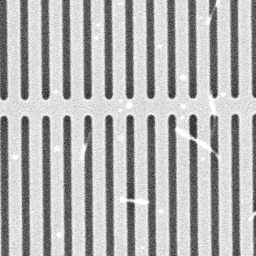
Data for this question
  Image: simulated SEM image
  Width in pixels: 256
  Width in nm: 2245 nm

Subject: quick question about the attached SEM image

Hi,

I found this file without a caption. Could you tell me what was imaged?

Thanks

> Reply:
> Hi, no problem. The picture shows groups of lines, slits or small figures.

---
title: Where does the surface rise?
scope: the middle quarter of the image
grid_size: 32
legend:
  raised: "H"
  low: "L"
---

LLHHHLLHHHLLHHHLLLHHLLLHHHLLHHHL
LLHHHLLHHHLLHHHLLLHHLLLHHHLLHHHL
LLHHHLLHHHLLHHHLLLHHLLLHHHLLHHHL
LLHHHLLHHHLLHHHLLLHHLLLHHHLLHHHL
LLHHHLLHHHLLHHHLLLHHLLLHHHLLHHHL
LLHHHLLHHHLLHHHLLLHHLLLHHHLLHHHL
LLHHHLLHHHLLHHHLLLHHLLLHHHLLHHHL
LLHHHLLHHHLLHHHLLLHHHLLHHHLLHHHL
LLHHHLLHHHLLHHHHLHHHHLHHHHLLHHHL
HHHHHHHHHHHHHHHHHHHHHHHHHHHHHHHH
HHHHHHHHHHHHHHHHHHHHHHHHHHHHHHHH
HHHHHHHHHHHHHHHHHHHHHHHHHHHHHHHH
HHHHHHHHHHHHHHHHLHHHHHHHHHHHHHHH
LLHHHLLHHHLLHHHLLLHHHLLHHHLLHHHL
LLHHHLLHHHLLHHHLLLHHHLLHHHLLHHHL
LLHHHLLHHHLLHHHLLLHHHLLHHHLLHHHL
LLHHHLLHHHLLHHHLLLHHHLLHHHLLHHHL
LLHHHLLHHHLLHHHLLLHHHLLHHHLLHHHL
LLHHHLLHHHLLLHHLLLHHHLLHHHLLHHHH
LLHHHLLHHHLLLHHLLLHHHLLHHHLLHHHL
LLHHHLLHHHLLLHHLLLHHHLLHHHLLHHHL
LLHHHLLHHHLLLHHLLLHHHLLHHHLLHHHL
LLHHHLLHHHLLLHHLLLHHHLLHHHLLHHHL
LLHHHLLHHHLLLHHLLLHHHLLHHHLLHHHL
LLHHHLLHHHLLLHHLLLHHHLLHHHLLHHHL
LLHHHLLHHHLLLHHLLLHHHLLHHHLLHHHL
LLHHHLLHHHLLLHHLLLHHHLLHHHLLHHHL
LLHHHLLHHHLLLHHLLLHHHLLHHHLLHHHL
LLHHHLLHHHLLLHHLLLHHHLLHHHLLHHHL
LLHHHLLHHHLLLHHLLLHHHLLHHHLLHHHL
LLHHHLLHHHLLLHHLLLHHHLLHHHLLHHHL
LLHHHLLHHHLLLHHLLLHHHLLHHHLLHHHL